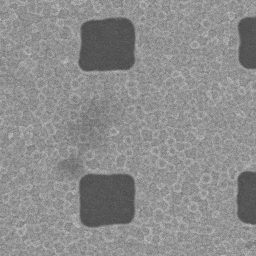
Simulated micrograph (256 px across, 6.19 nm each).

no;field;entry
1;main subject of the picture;holes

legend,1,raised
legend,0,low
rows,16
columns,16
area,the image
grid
1111111111111111
1111100011111110
1111100011111110
1111100011111110
1111111111111111
1111111111111111
1111111111111111
1111111111111111
1111111111111111
1111111111111111
1111111111111111
1111100011111110
1111100011111110
1111100011111110
1111111111111111
1111111111111111